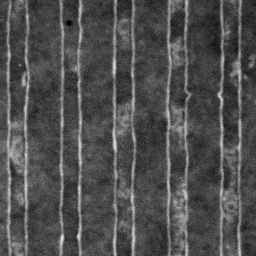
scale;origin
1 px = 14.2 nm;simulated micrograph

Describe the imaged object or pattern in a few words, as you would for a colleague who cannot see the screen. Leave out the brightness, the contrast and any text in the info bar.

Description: parallel lines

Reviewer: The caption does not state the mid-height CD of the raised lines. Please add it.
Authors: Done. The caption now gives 517 nanometers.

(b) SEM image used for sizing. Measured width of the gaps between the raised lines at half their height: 234 nm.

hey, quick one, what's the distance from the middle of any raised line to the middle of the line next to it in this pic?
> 756 nanometers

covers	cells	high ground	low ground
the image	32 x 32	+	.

+..+++++..+++++..++++..+++++..++
+..+++++..++++...++++..+++++..++
+..+++++..+++++..++++..+++++..++
+...++++..++++...++++..+++++..++
+..+++++..++++...++++..+++++..++
+..+++++..++++...++++..+++++..++
+..+++++..++++...++++..+++++..++
+..+++++..++++...++++..+++++..++
+..+++++..++++..+++++..+++++..++
+...++++..++++...++++..+++++..++
+..+++++..++++...++++..+++++..++
+..+++++..++++...++++..+++++..++
+..+++++..++++...++++..+++++..++
+..+++++..++++...++++..+++++..++
+..+++++..++++..+++++..+++++..++
+..+++++..++++..+++++..+++++..++
+..+++++..++++...++++..+++++..++
+..+++++..++++...++++..+++++..++
+..+++++..++++...++++..+++++..++
+..+++++..++++...++++..+++++..++
+..+++++..++++...++++..+++++..++
+..+++++..++++...++++..+++++..++
+..+++++..++++...++++..+++++..++
+..+++++..++++..+++++..+++++..++
+..+++++..++++..+++++..+++++..++
+..+++++..++++...++++..+++++..++
+..+++++..++++...++++..+++++..++
+..+++++..+++++..++++..+++++..++
+..+++++..++++...++++..+++++..++
+..+++++..++++...++++..+++++..++
+..+++++..++++...++++..+++++..++
+..+++++..++++...++++..+++++..++